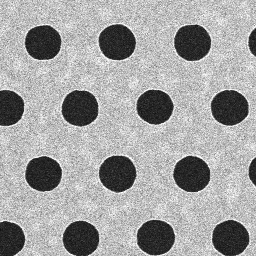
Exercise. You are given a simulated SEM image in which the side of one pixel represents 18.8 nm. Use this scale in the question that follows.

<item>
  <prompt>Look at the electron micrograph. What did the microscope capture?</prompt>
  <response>a regular array of holes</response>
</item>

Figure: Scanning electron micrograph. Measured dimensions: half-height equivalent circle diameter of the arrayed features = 697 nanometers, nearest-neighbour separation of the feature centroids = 1400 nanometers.